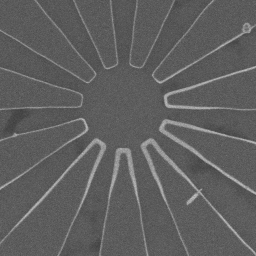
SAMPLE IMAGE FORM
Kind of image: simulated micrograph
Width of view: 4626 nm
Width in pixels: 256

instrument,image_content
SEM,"groups of lines, slits or small figures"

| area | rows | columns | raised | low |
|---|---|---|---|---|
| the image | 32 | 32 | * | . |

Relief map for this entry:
*****....*****...*****....******
******....****...****....*******
******....****...****....*******
*******....***...***....********
.*******...***...***...*******..
...******...**...**...******....
....******..***.***..******.....
......*****..**.**..*****.......
........***..*......***.........
***......***.......***......****
******...................*******
**********............**********
**********...........***********
***........................*****
................................
........***.........**..........
....*******..........******.....
*********.............*********.
********...**.....**....********
******....***..*..***....*******
*****....***..**...***....******
***.....****..***..****.....****
**.....****...***...****.....***
......*****...***...*****......*
......*****...***...*****.......
.....*****...****....*****......
....******...*****...******.....
...******....*****....******....
..*******....*****....*******...
.*******.....*****.....*******..
********.....*****.....********.
********....******.....*********